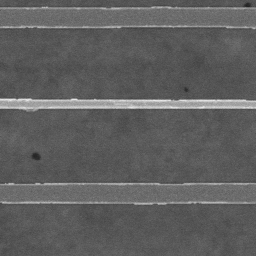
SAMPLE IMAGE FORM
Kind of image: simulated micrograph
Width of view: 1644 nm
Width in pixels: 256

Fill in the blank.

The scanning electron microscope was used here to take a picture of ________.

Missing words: lines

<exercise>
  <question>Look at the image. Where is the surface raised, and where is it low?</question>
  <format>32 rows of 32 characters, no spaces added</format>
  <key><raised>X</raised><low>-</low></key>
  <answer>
--------------------------------
XXXXXXXXXXXXXXXXXXXXXXXXXXXXXXXX
XXXXXXXXXXXXXXXXXXXXXXXXXXXXXXXX
--------------------------------
--------------------------------
--------------------------------
--------------------------------
--------------------------------
--------------------------------
--------------------------------
--------------------------------
--------------------------------
-X-X----------------------------
--------------------------------
--------------------------------
--------------------------------
--------------------------------
--------------------------------
--------------------------------
--------------------------------
--------------------------------
--------------------------------
--------------------------------
XXXXXXXXXXXXXXXXXXXXXXXXXXXXXXXX
XXXXXXXXXXXXXXXXXXXXXXXXXXXXXXXX
--------------------------------
--------------------------------
--------------------------------
--------------------------------
--------------------------------
--------------------------------
--------------------------------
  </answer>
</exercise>